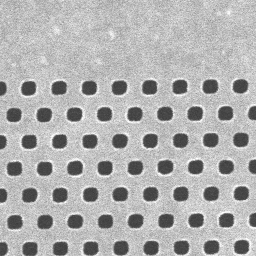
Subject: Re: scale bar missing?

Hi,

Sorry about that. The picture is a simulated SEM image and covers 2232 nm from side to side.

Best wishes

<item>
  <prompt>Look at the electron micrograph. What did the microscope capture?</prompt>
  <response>a regular array of holes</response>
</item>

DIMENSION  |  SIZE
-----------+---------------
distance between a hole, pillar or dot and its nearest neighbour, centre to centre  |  262 nm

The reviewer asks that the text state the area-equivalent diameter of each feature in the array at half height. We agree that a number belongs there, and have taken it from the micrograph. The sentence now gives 0.14 um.